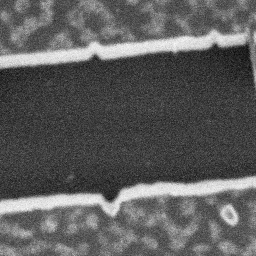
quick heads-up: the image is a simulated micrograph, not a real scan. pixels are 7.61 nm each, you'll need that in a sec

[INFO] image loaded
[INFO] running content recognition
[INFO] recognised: one or a few lines or trenches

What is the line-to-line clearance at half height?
1100 nm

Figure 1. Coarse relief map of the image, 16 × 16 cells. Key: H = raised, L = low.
HHHHHHHHHHHHHHHH
HHHHHHHHHHHHHHHH
HHHHHHHHHHHHHLLH
HHHHLLLLLLLLLLLL
LLLLLLLLLLLLLLLL
LLLLLLLLLLLLLLLL
LLLLLLLLLLLLLLLL
LLLLLLLLLLLLLLLL
LLLLLLLLLLLLLLLL
LLLLLLLLLLLLLLLL
LLLLLLLLLLLLLLLL
LLLLLLLLLLLLLLLH
LLLLHHLHHHHHHHHH
HHHHHHHHHHHHHHHH
HHHHHHHHHHHHHHHH
HHHHHHHHHHHHHHHH